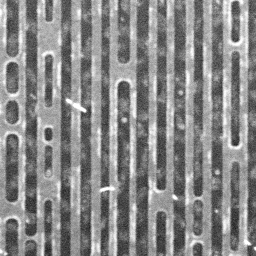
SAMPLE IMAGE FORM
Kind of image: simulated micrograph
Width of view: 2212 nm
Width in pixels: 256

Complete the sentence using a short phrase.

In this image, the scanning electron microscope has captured parallel lines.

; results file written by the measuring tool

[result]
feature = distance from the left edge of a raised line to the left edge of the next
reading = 160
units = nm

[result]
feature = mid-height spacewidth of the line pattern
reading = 98.2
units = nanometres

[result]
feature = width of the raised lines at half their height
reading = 61.5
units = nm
